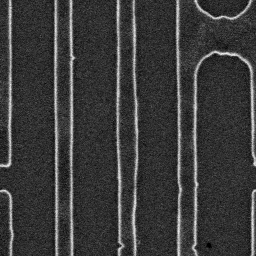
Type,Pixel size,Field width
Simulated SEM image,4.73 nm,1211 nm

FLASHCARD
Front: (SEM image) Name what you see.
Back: one or a few lines or trenches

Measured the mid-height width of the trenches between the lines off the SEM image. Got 214 nm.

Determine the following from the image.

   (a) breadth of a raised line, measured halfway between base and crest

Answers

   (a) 16.7 px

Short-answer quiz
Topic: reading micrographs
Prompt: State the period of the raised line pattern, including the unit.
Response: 62 pixels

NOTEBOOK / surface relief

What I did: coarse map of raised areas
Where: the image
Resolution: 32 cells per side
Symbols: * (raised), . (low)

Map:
*......**......**.....***......*
*......**......**.....****....**
*......**......**.....**********
*......**......**.....**********
*......**......**.....**********
*......**......**.....**********
*......**......**.....**********
*......**......**.....***.....**
*......**......**.....***......*
*......**......**.....**.......*
*......**......**.....**.......*
*......**......**.....**.......*
*......**......**.....**........
*......**......**.....**........
*......**......**.....**........
*......**......**.....**........
*......**......**.....**........
*......**......**.....**........
*......**......**.....**........
*......**......**.....**........
*......**......**.....**........
.......**......**.....**........
.......**......**.....**........
.......**......**.....**........
*......**......**.....**........
*......**......**.....**........
*......**......**.....**........
*......**......**.....**........
*......**......**.....**........
**.....**......**.....**........
*......**......**.....**........
*......**......**.....**........